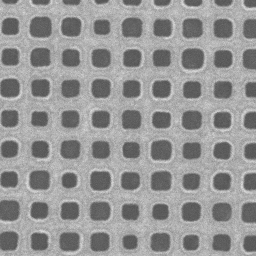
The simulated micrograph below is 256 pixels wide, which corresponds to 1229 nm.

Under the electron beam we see a regular array of holes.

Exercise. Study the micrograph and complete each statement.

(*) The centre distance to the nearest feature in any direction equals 30.1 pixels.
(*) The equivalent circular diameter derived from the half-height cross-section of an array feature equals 97.1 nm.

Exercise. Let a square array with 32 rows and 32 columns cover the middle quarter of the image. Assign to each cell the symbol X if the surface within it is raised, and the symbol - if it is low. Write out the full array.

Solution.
---XXXX----XXXX----XXXX---XXXX--
XXXXXXXXXXXXXXXXXXXXXXXXXXXXXXXX
XXXXXXXXXXXXXXXXXXXXXXXXXXXXXXXX
XXXXXXXXXXXXXXXXXXXXXXXXXXXXXXXX
----XXX-----XXX----XXXX----XXX--
----XXX-----XXX----XXX-----XXX--
----XXX-----XXX----XXX-----XXX--
----XXX-----XXX----XXX-----XXX--
--XXXXXX---XXXXX--XXXXX---XXXX--
XXXXXXXXXXXXXXXXXXXXXXXXXXXXXXXX
XXXXXXXXXXXXXXXXXXXXXXXXXXXXXXXX
X--XXXXX--XXXXX---XXXXXXXXXXXXX-
----XXX----XXX-----XXX-----XXX--
----XXX-----XX------XX-----XX---
----XXX-----XX------XX-----XX---
----XXX----XXX-----XXX----XXXX--
XXXXXXXXXXXXXXXX--XXXXXXXXXXXXXX
XXXXXXXXXXXXXXXXXXXXXXXXXXXXXXXX
XXXXXXXXXXXXXXXXXXXXXXXXXXXXXXXX
----XXX----XXXXX--XXXX-----XXX--
----XXX-----XXX----XX------XXX--
----XXX-----XXX----XX------XX---
----XXX-----XXX----XX------XXX--
---XXXXX---XXXX---XXXX-----XXX--
XXXXXXXXXXXXXXXXXXXXXXXXXXXXXXXX
XXXXXXXXXXXXXXXXXXXXXXXXXXXXXXXX
XXXXXXXXXXXXXXXXXXXXXXXXXXXXXXXX
---XXXX-----XX-----XXX-----XXX--
----XX------XX-----XX------XXX--
----XX------XX-----XX------XXX--
---XXXX----XXX-----XXX-----XXX--
XXXXXXX----XXXX--XXXXX-----XXXX-